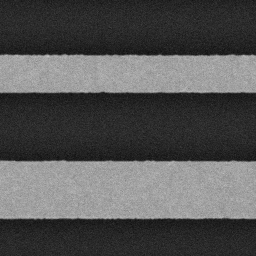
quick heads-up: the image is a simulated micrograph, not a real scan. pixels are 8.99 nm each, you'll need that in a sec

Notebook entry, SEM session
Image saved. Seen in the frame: lines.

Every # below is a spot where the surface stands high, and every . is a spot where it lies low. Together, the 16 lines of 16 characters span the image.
................
................
................
#########.....##
################
################
................
................
................
................
################
################
################
################
................
................